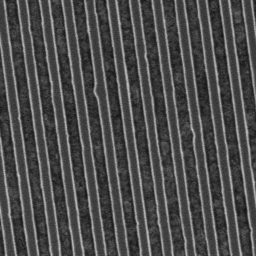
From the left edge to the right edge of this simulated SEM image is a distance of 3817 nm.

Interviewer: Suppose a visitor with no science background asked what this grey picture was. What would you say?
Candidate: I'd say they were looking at parallel lines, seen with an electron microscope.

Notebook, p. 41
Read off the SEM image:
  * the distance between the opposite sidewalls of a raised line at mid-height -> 10.2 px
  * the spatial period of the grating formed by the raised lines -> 333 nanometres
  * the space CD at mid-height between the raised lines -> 192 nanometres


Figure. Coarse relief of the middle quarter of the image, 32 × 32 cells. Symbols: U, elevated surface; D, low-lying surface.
DDUUDDDUUUDDDUUDDDDUUDDDUUUDDDUU
DDUUDDDDUUDDDUUUDDDUUDDDUUUDDDUU
DDUUDDDDUUDDDUUUDDDUUDDDUUUDDDUU
DDUUUDDDUUDDDUUUDDDUUDDDDUUDDDUU
DDUUUDDDUUDDDDUUDDDUUUDDDUUDDDUU
DDUUUDDDUUDDDDUUDDDUUUDDDUUDDDUU
DDUUUDDDUUUDDDUUDDDUUUDDDUUDDDDU
DDDUUDDDUUUDDDUUDDDDUUDDDUUDDDDU
DDDUUDDDUUUDDDUUDDDDUUDDDUUUDDDU
DDDUUDDDDUUDDDUUUDDDUUDDDUUUDDDU
DDDUUUDDDUUDDDUUUDDDUUDDDDUUDDDU
DDDUUUDDDUUDDDUUUDDDUUDDDDUUDDDU
DDDUUUDDDUUDDDDUUDDDUUUDDDUUDDDU
DDDDUUDDDUUDDDDUUDDDUUUDDDUUDDDD
UDDDUUDDDUUUDDDUUDDDUUUDDDUUDDDD
UDDDUUDDDUUUDDDUUDDDDUUDDDUUUDDD
UDDDUUDDDDUUDDDUUDDDDUUDDDUUUDDD
UDDDUUDDDDUUDDDUUDDDDUUDDDUUUDDD
UDDDUUDDDDUUDDDUUUDDDUUDDDDUUDDD
UDDDUUUDDDUUDDDDUUDDDUUDDDDUUDDD
UDDDDUUDDDUUDDDDUUDDDUUDDDDUUDDD
UDDDDUUDDDUUUDDDUUDDDUUUDDDUUDDD
UDDDDUUDDDUUUDDDUUDDDDUUDDDUUUDD
UDDDDUUDDDUUUDDDUUDDDDUUDDDUUUDD
UUDDDUUDDDDUUDDDUUDDDDUUDDDUUUDD
UUDDDUUUDDDUUDDDUUUDDDUUDDDDUUDD
UUDDDUUUDDDUUDDDUUUDDDUUDDDDUUDD
UUDDDUUUDDDUUDDDDUUDDDUUUDDDUUDD
UUDDDUUUDDDUUUDDDUUDDDUUUDDDUUDD
UUDDDDUUDDDUUUDDDUUDDDUUUDDDUUDD
UUDDDDUUDDDUUUDDDUUDDDDUUDDDUUUD
UUUDDDUUDDDDUUDDDUUDDDDUUDDDUUUD